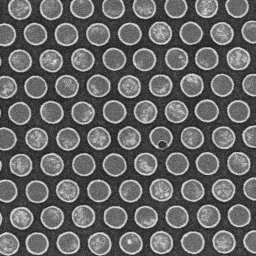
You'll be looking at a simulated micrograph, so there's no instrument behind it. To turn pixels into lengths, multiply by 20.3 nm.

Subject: a regular array of raised bodies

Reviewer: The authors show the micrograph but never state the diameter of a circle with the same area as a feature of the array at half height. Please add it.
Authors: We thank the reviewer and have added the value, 449 nanometers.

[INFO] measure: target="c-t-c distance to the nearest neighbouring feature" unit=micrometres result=0.608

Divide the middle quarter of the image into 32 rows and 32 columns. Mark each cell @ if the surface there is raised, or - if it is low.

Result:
--@@@@@---@@@@@---@@@@----@@@@--
----@--------------@@-----------
--------------------------------
@@@----@@@@----@@@----@@@@----@@
@@@---@@@@@---@@@@@---@@@@@--@@@
@@@@--@@@@@@--@@@@@---@@@@@--@@@
@@@---@@@@@---@@@@@---@@@@@---@@
@@@----@@@@---@@@@@---@@@@-----@
--------------------------------
-----------@@@------@------@@---
--@@@@@---@@@@@---@@@@@---@@@@--
--@@@@@---@@@@@---@@@@@--@@@@@@-
--@@@@@---@@@@@---@@@@@--@@@@@@-
--@@@@@---@@@@@---@@@@@---@@@@--
----@@------@@-----@@@----------
--------------------------------
@@@----@@@-----@@@----@@@@----@@
@@@---@@@@@---@@@@@---@@@@@--@@@
@@@@--@@@@@---@@@@@---@@@@@--@@@
@@@@--@@@@@---@@@@@---@@-@@---@@
@@@----@@@@---@@@@-------------@
--------------------------------
----@@---------------------@@@--
---@@@@---@@@@@---@@@@@---@@@@@-
--@@@@@@--@@@@@---@@@@@---@@@@@-
--@@@@@@--@@@@@---@@@@@---@@@@@-
---@@@@---@@@@@---@@@@@---@@@@@-
----@@-----@@@-----@@@----------
--------------------------------
@@-----@@@-----@@@----@@@@----@@
@@@---@@@@@---@@@@@---@@@@@---@@
@@@---@@@@@---@@@@@---@@@@@--@@@